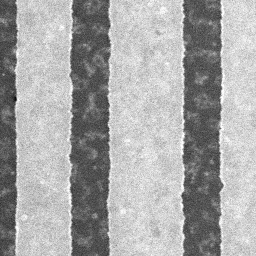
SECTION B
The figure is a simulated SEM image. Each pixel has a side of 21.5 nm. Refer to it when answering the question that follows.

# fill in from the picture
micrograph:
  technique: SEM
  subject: one or a few lines or trenches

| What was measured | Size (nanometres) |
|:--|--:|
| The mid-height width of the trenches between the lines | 827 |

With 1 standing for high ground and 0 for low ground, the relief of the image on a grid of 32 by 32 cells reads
00111111100000111111111000001111
00111111100000111111111000001111
00111111100000111111111000001111
00111111100000111111111000001111
00111111100000111111111000001111
00111111100000111111111000001111
00111111100000111111111000001111
00111111100010111111111000001111
00111111100000111111111000001111
00111111100000111111111000001111
00111111100000111111111000001111
00111111100000111111111000001111
00111111100000111111111000001111
00111111100000111111111000001111
00111111100000111111111000001111
00111111100000111111111000001111
00111111100000111111111000001111
00111111100000111111111000011111
00111111100000111111111000011111
00111111100000111111111000001111
00111111100000111111111000001111
00111111100000111111111000001111
00111111100000111111111000001111
00111111100000111111111000001111
00111111100000111111111000001111
00111111100001111111111000001111
00111111100000111111111000001111
00111111100000111111111000001111
00111111100000111111111000001111
00111111100000111111111000001111
00111111100000111111111000001111
00111111100000111111111000001111